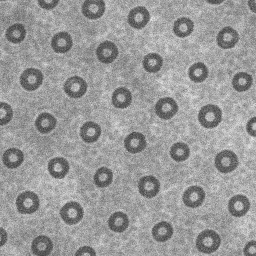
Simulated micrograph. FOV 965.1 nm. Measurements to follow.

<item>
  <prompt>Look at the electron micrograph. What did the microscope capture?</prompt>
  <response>a regular array of ring-shaped grooves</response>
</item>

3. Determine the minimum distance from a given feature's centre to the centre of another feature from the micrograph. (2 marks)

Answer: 171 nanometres